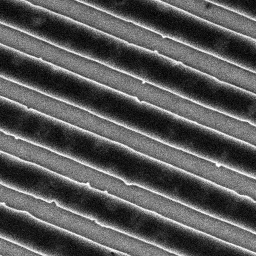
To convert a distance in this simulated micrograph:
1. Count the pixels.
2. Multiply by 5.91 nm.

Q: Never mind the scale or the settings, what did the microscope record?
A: parallel lines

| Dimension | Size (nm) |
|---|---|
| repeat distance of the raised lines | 292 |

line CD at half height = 183 nm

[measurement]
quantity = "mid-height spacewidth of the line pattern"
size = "0.112 um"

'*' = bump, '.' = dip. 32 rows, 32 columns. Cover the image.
****.......**********......*****
*******......**********......***
*********......***********......
..**********......**********....
....**********......***********.
.......*********.......*********
***......**********......*******
*****.......**********......****
********......**********......**
**********......**********......
..***********......**********...
.....**********......**********.
*......**********.......********
****......**********......******
******......**********.......***
*********......**********......*
***********......**********.....
...***********......**********..
.....***********......**********
**......**********.......*******
****......***********......*****
*******......**********.......**
*********......***********......
.***********......**********....
....**********......***********.
.......**********......*********
***......**********......*******
*****......**********.......****
********......**********......**
**********......***********.....
..**********.......**********...
....***********......***********